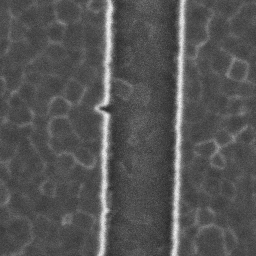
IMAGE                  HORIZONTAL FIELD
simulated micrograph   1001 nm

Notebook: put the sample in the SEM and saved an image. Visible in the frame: one or a few lines or trenches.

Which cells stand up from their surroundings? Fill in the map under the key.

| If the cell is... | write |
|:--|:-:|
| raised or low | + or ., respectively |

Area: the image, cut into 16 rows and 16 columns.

+++++++....+++++
+++++++....+++++
+++++++....+++++
+++++++....+++++
+++++++....+++++
+++++++....+++++
++++++.....+++++
+++++++....+++++
+++++++....+++++
+++++++....+++++
+++++++....+++++
+++++++....+++++
+++++++....+++++
++++++.....+++++
++++++.....+++++
++++++.....+++++